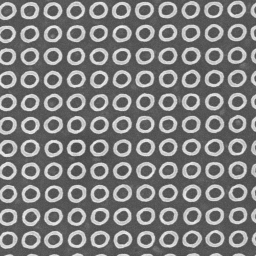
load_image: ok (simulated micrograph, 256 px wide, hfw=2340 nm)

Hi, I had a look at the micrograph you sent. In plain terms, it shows a regular array of ring-shaped raised bodies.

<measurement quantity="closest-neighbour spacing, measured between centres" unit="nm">205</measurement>